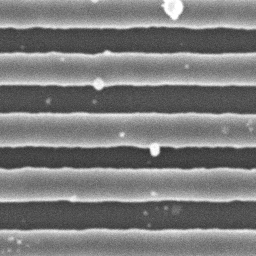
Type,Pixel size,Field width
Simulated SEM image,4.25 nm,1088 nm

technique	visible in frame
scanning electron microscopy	lines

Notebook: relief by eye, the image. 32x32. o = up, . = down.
oooooooooooooooooooooooooooooooo
oooooooooooooooooooooooooooooooo
oooooooooooooooooooooooooooooooo
..o.....o.....o.........oo...ooo
................................
................................
.............o..................
oooooooooooooooooooooooooooooooo
oooooooooooooooooooooooooooooooo
oooooooooooooooooooooooooooooooo
oooooooooooooooooooooooooooooooo
................................
................................
................................
oooooooooooooooooooooooooooooooo
oooooooooooooooooooooooooooooooo
oooooooooooooooooooooooooooooooo
oooooooooooooooooooooooooooooooo
..................oo............
................................
................................
oooooooooooooooooooooooooooooooo
oooooooooooooooooooooooooooooooo
oooooooooooooooooooooooooooooooo
oooooooooooooooooooooooooooooooo
................................
................................
................................
................................
oooooooooooooooooooooooooooooooo
oooooooooooooooooooooooooooooooo
oooooooooooooooooooooooooooooooo